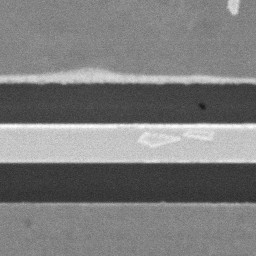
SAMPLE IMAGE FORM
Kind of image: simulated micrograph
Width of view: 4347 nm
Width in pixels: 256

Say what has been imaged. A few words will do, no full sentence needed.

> lines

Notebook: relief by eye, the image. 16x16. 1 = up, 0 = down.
1111111111111111
1111111111111111
1111111111111111
1111111111111111
1111111111111111
0000000000000000
0000000000000000
0000000000000000
1111111111111111
1111111111111111
0000000000000000
0000000000000000
0000000000000000
1111111111111111
1111111111111111
1111111111111111